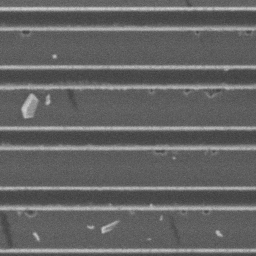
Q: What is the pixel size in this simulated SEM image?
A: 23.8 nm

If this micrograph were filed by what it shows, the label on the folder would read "lines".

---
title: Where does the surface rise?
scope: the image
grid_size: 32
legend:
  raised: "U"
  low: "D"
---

DDDDDDDDDDDDDDDDDDDDDDDDDDDDDDDD
UUUUUUUUUUUUUUUUUUUUUUUUUUUUUUUU
UUUUUUUUUUUUUUUUUUUUUUUUUUUUUUUU
UUUUUUUUUUUUUUUUUUUUUUUUUUUUUUUU
DDDDDDDDDDDDDDDDDDDDDDDDDDDDDDDD
DDDDDDDDDDDDDDDDDDDDDDDDDDDDDDDD
DDDDDDDDDDDDDDDDDDDDDDDDDDDDDDDD
DDDDDDDDDDDDDDDDDDDDDDDDDDDDDDDD
UUUUUUUUUUUUUUUUUUUUUUUUUUUUUUUU
UUUUUUUUUUUUUUUUUUUUUUUUUUUUUUUU
UUUUUUUUUUUUUUUUUUUUUUUUUUUUUUUU
DDDDDDDDDDDDDDDDDDDDDDDDDDDDDDDD
DDDDDDDDDDDDDDDDDDDDDDDDDDDDDDDD
DDDDDDDDDDDDDDDDDDDDDDDDDDDDDDDD
DDDDDDDDDDDDDDDDDDDDDDDDDDDDDDDD
DDDDDDDDDDDDDDDDDDDDDDDDDDDDDDDD
UUUUUUUUUUUUUUUUUUUUUUUUUUUUUUUU
UUUUUUUUUUUUUUUUUUUUUUUUUUUUUUUU
UUUUUUUUUUUUUUUUUUUUUUUUUUUUUUUU
DDDDDDDDDDDDDDDDDDDDDDDDDDDDDDDD
DDDDDDDDDDDDDDDDDDDDDDDDDDDDDDDD
DDDDDDDDDDDDDDDDDDDDDDDDDDDDDDDD
DDDDDDDDDDDDDDDDDDDDDDDDDDDDDDDD
DDDDUDDUDDDDDDDDDDDDDDDDDDDDDDDD
UUUUUUUUUUUUUUUUUUUUUUUUUUUUUUUU
UUUUUUUUUUUUUUUUUUUUUUUUUUUUUUUU
DDDDDDDDDDDDDDDDDDDDDDDDDDDDDDDD
DDDDDDDDDDDDDDDDDDDDDDDDDDDDDDDD
DDDDDDDDDDDDDDDDDDDDDDDDDDDDDDDD
DDDDDDDDDDDDDDDDDDDDDDDDDDDDDDDD
DDDDDDDDDDDDDDDDDDDDDDDDDDDDDDDD
UUUUUUUUUUUUUUUUUUUUUUUUUUUUUUUU